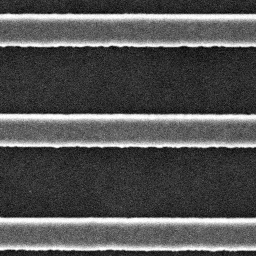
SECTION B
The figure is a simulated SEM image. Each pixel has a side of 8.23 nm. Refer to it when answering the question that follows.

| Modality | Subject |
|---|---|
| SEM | lines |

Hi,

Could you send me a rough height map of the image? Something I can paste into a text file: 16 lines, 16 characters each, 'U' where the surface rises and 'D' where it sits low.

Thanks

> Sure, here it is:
DDDDDDDDDDDDDDDD
UUUUUUUUUUUUUUUU
UUUUUUUUUUUUUUUU
DDDDDDDDDDDDDDDD
DDDDDDDDDDDDDDDD
DDDDDDDDDDDDDDDD
DDDDDDDDDDDDDDDD
UUUUUUUUUUUUUUUU
UUUUUUUUUUUUUUUU
DDDDDDDDDDDDDDDD
DDDDDDDDDDDDDDDD
DDDDDDDDDDDDDDDD
DDDDDDDDDDDDDDDD
DDDDDDDDDDDDDDDD
UUUUUUUUUUUUUUUU
UUUUUUUUUUUUUUUU